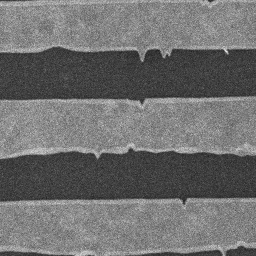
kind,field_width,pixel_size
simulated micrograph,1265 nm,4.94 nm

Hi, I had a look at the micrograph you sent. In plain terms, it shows one or a few lines or trenches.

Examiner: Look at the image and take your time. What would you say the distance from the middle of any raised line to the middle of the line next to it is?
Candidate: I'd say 99.7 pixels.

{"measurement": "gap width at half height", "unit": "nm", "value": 249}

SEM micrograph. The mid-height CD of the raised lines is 241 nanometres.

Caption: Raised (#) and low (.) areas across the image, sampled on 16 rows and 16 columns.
################
################
################
................
................
................
########.#######
################
################
###........#####
................
................
................
################
################
#############...